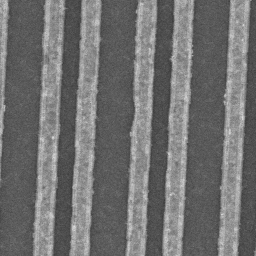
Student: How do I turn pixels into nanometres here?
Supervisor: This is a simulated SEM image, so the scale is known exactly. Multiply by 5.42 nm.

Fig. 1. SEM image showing parallel lines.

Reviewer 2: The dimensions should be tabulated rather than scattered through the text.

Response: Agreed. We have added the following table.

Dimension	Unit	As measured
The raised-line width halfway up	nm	85.9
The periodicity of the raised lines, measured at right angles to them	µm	0.25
